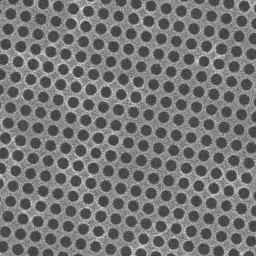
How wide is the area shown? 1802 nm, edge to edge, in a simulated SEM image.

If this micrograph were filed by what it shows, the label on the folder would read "a regular array of holes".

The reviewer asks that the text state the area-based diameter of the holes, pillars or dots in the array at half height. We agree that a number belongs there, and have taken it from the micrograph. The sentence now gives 82.1 nm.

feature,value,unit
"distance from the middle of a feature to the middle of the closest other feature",0.106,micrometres